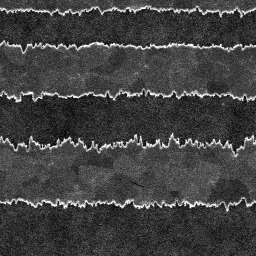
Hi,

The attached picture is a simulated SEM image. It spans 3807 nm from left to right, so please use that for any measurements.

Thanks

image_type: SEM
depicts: one or a few lines or trenches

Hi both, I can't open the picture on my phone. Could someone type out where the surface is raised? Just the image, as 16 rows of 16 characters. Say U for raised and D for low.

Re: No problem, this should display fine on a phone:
UUUUUUUUUUUUUUUU
DDDDDDDDDDDDDDDD
DDDDDDDDDDDDDDDD
UUUUUUUUUUUUUUUU
UUUUUUUUUUUUUUUU
UUUUUUUUUUUUUUUU
DDDDDDDDDDDDDDDD
DDDDDDDDDDDDDDDD
DDDDDDDDDDDDDDDD
UUUUUUUUUUUUUUUU
UUUUUUUUUUUUUUUU
UUUUUUUUUUUUUUUU
UUUUUUUUUUUUUUUU
DDDDDDDDDDDDDDDD
DDDDDDDDDDDDDDDD
DDDDDDDDDDDDDDDD